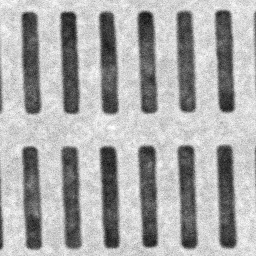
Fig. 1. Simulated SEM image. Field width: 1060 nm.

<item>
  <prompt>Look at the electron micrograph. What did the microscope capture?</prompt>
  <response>a regular array of holes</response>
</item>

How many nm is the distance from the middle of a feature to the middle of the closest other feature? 160